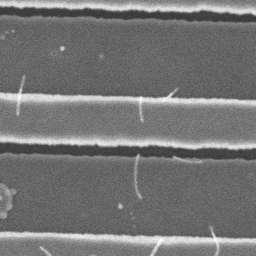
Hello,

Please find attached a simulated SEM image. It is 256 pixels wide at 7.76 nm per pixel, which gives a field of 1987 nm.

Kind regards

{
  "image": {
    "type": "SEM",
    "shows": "lines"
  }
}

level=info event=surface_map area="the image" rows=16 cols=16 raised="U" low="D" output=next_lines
DDDDUDUUUUUUUUUU
DDDDDDDDDDDDDDDD
DDDDDDDDDDDDDDDD
DDDDDDDDDDDDDDDD
DDDDDDDDDDDDDDDD
DDDDDDDDDDDDDDDD
UUUUUUUUUUUUUUUU
UUUUUUUUUUUUUUUU
UUUUUUUUUUUUUUUU
DDDDDDDDDDDDDDDD
DDDDDDDDDDDDDDDD
DDDDDDDDDDDDDDDD
DDDDDDDDDDDDDDDD
DDDDDDDDDDDDDDDD
DDDDDDDDDDDDDDDD
UUUUUUUUUUUUUUUU